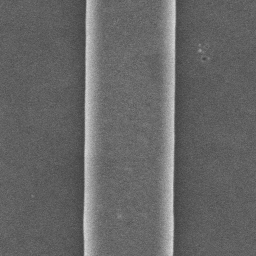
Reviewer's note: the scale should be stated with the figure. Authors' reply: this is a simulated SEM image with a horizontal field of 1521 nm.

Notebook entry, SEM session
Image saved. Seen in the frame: wiring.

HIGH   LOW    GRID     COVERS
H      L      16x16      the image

LLLLLHHHHHHLLLLL
LLLLLHHHHHHLLLLL
LLLLLHHHHHHLLLLL
LLLLLHHHHHHLLLLL
LLLLLHHHHHHLLLLL
LLLLLHHHHHHLLLLL
LLLLLHHHHHHLLLLL
LLLLLHHHHHHLLLLL
LLLLLHHHHHHLLLLL
LLLLLHHHHHHLLLLL
LLLLLHHHHHHLLLLL
LLLLLHHHHHHLLLLL
LLLLLHHHHHHLLLLL
LLLLLHHHHHHLLLLL
LLLLLHHHHHHLLLLL
LLLLLHHHHHHLLLLL